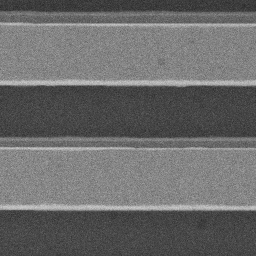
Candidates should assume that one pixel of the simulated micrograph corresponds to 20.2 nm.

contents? lines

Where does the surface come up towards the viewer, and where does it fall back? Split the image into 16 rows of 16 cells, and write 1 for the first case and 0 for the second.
0000000000000000
1111111111111111
1111111111111111
1111111111111111
1111111111111111
0000000000000000
0000000000000000
0000000000000000
0000000000000000
1111111111111111
1111111111111111
1111111111111111
1111111111111111
0000000000000000
0000000000000000
0000000000000000